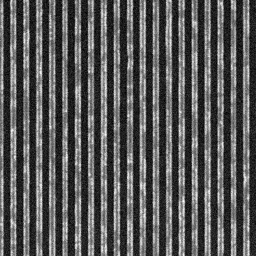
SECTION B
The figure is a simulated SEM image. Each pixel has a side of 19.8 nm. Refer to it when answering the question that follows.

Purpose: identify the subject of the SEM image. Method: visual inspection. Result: parallel lines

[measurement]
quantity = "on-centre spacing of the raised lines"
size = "257 nanometers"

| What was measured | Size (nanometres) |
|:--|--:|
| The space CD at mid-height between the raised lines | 151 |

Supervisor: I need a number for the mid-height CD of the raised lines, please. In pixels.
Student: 4.87